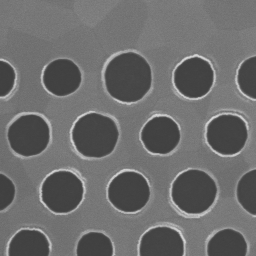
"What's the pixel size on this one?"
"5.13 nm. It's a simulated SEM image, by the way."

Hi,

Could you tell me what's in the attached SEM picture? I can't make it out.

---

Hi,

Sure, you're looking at a regular array of holes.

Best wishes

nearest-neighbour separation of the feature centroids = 336 nanometres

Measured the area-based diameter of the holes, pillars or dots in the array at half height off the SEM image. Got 208 nanometres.